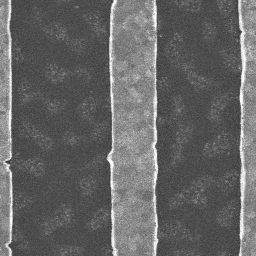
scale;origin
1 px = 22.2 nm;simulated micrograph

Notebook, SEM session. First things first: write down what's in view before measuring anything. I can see one or a few lines or trenches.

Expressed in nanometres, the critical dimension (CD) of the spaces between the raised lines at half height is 2090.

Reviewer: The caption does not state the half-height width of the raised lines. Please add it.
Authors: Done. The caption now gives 973 nm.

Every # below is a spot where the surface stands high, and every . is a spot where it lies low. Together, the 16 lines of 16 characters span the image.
#......###.....#
#......###.....#
#......###.....#
#......###.....#
#......###.....#
#......###.....#
#......###.....#
#......###.....#
#......###.....#
#......###.....#
#......###.....#
#......###.....#
#......###.....#
#......###.....#
#......###.....#
#......###.....#